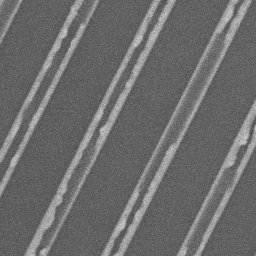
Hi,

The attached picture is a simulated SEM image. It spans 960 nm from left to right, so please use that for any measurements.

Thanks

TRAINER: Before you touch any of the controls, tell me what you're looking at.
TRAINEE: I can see one or a few lines or trenches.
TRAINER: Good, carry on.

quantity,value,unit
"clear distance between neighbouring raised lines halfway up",191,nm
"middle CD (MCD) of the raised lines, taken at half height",66.4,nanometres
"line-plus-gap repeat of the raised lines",256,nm